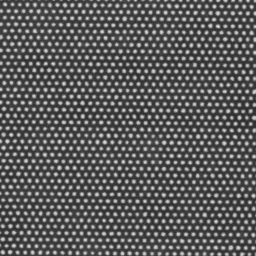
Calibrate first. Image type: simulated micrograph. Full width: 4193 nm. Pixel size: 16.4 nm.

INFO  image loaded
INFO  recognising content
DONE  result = a regular array of raised bodies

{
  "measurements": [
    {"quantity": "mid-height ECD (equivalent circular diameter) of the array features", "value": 58.4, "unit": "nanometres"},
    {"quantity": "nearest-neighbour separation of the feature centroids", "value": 114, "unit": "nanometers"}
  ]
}